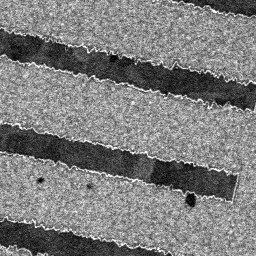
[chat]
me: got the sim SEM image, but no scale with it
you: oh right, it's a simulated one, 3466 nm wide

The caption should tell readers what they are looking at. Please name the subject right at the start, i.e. one or a few lines or trenches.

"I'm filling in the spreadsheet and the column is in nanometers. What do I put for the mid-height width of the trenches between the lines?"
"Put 869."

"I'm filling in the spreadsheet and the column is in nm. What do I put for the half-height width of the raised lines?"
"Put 374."